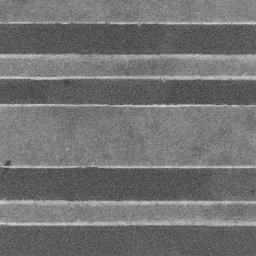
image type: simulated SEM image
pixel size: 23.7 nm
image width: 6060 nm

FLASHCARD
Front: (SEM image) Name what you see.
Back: lines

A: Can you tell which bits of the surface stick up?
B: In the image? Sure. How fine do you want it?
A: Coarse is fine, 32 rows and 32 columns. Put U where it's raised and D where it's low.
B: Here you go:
UUUUUUUUUUUUUUUUUUUUUUUUUUUUUUUU
UUUUUUUUUUUUUUUUUUUUUUUUUUUUUUUU
UUUUUUUUUUUUUUUUUUUUUUUUUUUUUUUU
DDDDDDDDDDDDDDDDDDDDDDDDDDDDDDDD
DDDDDDDDDDDDDDDDDDDDDDDDDDDDDDDD
DDDDDDDDDDDDDDDDDDDDDDDDDDDDDDDD
DDDDDDDDDDDDDDDDDDDDDDDDDDDDDDDD
UUUUUUUUUUUUUUUUUUUUUUUUUUUUUUUU
UUUUUUUUUUUUUUUUUUUUUUUUUUUUUUUU
UUUUUUUUUUUUUUUUUUUUUUUUUUUUUUUU
DDDDDDDDDDDDDDDDDDDDDDDDDDDDDDDD
DDDDDDDDDDDDDDDDDDDDDDDDDDDDDDDD
DDDDDDDDDDDDDDDDDDDDDDDDDDDDDDDD
UUUUUUUUUUUUUUUUUUUUUUUUUUUUUUUU
UUUUUUUUUUUUUUUUUUUUUUUUUUUUUUUU
UUUUUUUUUUUUUUUUUUUUUUUUUUUUUUUU
UUUUUUUUUUUUUUUUUUUUUUUUUUUUUUUU
UUUUUUUUUUUUUUUUUUUUUUUUUUUUUUUU
UUUUUUUUUUUUUUUUUUUUUUUUUUUUUUUU
UUUUUUUUUUUUUUUUUUUUUUUUUUUUUUUU
UUUUUUUUUUUUUUUUUUUUUUUUUUUUUUUU
DDDDDDDDDDDDDDDDDDDDDDDDDDDDDDDD
DDDDDDDDDDDDDDDDDDDDDDDDDDDDDDDD
DDDDDDDDDDDDDDDDDDDDDDDDDDDDDDDD
DDDDDDDDDDDDDDDDDDDDDDDDDDDDDDDD
UUUUUUUUUUUUUUUUUUUUUUUUUUUUUUUU
UUUUUUUUUUUUUUUUUUUUUUUUUUUUUUUU
UUUUUUUUUUUUUUUUUUUUUUUUUUUUUUUU
DDDDDDDDDDDDDDDDDDDDDDDDDDDDDDDD
DDDDDDDDDDDDDDDDDDDDDDDDDDDDDDDD
DDDDDDDDDDDDDDDDDDDDDDDDDDDDDDDD
DDDDDDDDDDDDDDDDDDDDDDDDDDDDDDDD